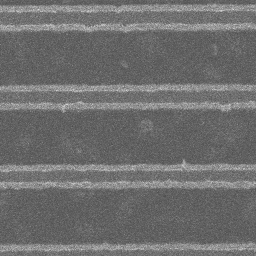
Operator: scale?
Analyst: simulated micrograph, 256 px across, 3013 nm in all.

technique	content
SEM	one or a few lines or trenches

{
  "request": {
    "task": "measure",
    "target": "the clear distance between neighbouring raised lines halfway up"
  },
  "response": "700 nm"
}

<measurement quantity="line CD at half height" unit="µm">0.237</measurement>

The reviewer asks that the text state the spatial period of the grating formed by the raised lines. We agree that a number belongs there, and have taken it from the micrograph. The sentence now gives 933 nanometers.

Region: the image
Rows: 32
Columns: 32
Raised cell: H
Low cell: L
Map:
LLLLLLLLLLLLLLLLLLLLLLLLLLLLLLLL
HHHHHHHHHHHHHHHHHHHHHHHHHHHHHHHH
HHHHHHHHHHHHHHHHHHHHHHHHHHHHHHHH
HHHHHHHHHHHHHHHHHLLLLLHLLLLLLLLL
LLLLLLLLLLLLLLLLLLLLLLLLLLLLLLLL
LLLLLLLLLLLLLLLLLLLLLLLLLLLLLLLL
LLLLLLLLLLLLLLLLLLLLLLLLLLLLLLLL
LLLLLLLLLLLLLLLLLLLLLLLLLLLLLLLL
LLLLLLLLLLLLLLLLLLLLLLLLLLLLLLLL
LLLLLLLLLLLLLLLLLLLLLLLLLLLLLLLL
LLLLLLLLLLLLLLLLLLLLLLLLLLLLLLLL
HHHHHHHHHHHHHHHHHHHHHHHHHHHHHHHH
HHHHHHHHHHHHHHHHHHHHHHHHHHHHHHHH
LLLLLLLLLLLLLLLLLLLLLLLLLLLHHLLL
LLLLLLLLLLLLLLLLLLLLLLLLLLLLLLLL
LLLLLLLLLLLLLLLLLLLLLLLLLLLLLLLL
LLLLLLLLLLLLLLLLLLLLLLLLLLLLLLLL
LLLLLLLLLLLLLLLLLLLLLLLLLLLLLLLL
LLLLLLLLLLLLLLLLLLLLLLLLLLLLLLLL
LLLLLLLLLLLLLLLLLLLLLLLLLLLLLLLL
LLLLLLLLLLLLLLLLLLLLLLLLLLLLLLLL
HHHHHHHHHHHHHHHHHHHHHHHHHHHHHHHH
HHHHHHHHHHHHHHHHHHHHHHHHHHHHHHHH
LLLLLLLLLLLLLLLLLLLLLLLLLLLLLLLL
LLLLLLLLLLLLLLLLLLLLLLLLLLLLLLLL
LLLLLLLLLLLLLLLLLLLLLLLLLLLLLLLL
LLLLLLLLLLLLLLLLLLLLLLLLLLLLLLLL
LLLLLLLLLLLLLLLLLLLLLLLLLLLLLLLL
LLLLLLLLLLLLLLLLLLLLLLLLLLLLLLLL
LLLLLLLLLLLLLLLLLLLLLLLLLLLLLLLL
LLLLLLLLLLLLLLLLLLLLLLLLLLLLLLLL
HHHHHHHHHHHHHHHHHHHHHHHHHHHHHHHH